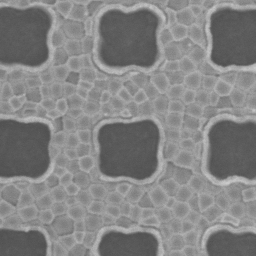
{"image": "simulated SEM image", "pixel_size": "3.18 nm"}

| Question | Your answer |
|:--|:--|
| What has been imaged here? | holes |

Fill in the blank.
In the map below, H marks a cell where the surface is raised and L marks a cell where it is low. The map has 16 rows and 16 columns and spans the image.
LHLHHHHHHHHHHHHH
LLLHHHLLLLHHHLLL
LLLHHHLLLLHHHLLL
LLLHHHLLLLHHHLLL
HHHHHHHHHHHHHHHH
HHHHHHHHHHHHHHHH
HHHHHHHHHHHHHHHH
LHHHHHHHHHHHHHHH
LLLHHHLLLLHHHLLL
LLLHHHLLLLHHHLLL
LLLHHHLLLLHHHLLL
HHHHHHHHHHHHHHHH
HHHHHHHHHHHHHHHH
HHHHHHHHHHHHHHHH
LLHHHHHHHHHHHLLH
LLLHHHLLLLHHHLLL